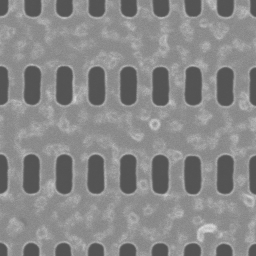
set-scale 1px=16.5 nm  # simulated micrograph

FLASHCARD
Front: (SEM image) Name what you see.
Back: a regular array of holes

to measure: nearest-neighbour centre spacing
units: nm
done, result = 527